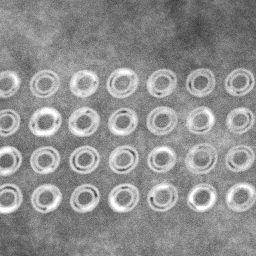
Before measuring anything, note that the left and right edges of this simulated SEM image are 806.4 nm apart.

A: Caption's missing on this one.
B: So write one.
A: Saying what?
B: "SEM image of a regular array of ring-shaped raised bodies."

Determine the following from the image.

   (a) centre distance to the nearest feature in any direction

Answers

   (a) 119 nm